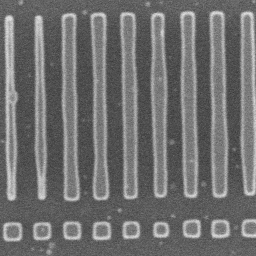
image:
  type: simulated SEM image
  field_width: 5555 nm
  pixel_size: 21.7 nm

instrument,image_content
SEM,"groups of lines, slits or small figures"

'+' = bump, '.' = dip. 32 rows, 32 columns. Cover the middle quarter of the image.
+++.....++.....+++....+++.....++
+++.....++.....+++....+++.....++
+++.....++.....+++....+++.....++
+++.....++.....+++....+++.....++
+++.....++.....+++....+++.....++
+++.....++.....+++....+++.....++
+++.....++.....+++....+++.....++
+++.....++.....+++....+++.....++
+++.....++.....+++....+++.....++
+++.....++.....+++....+++.....++
+++.....++.....+++....+++.....++
+++.....++.....+++....+++.....++
+++.....++.....+++....+++.....++
+++.....++.....+++....+++.....++
+++.....++.....+++.....++.....++
+++.....++.....+++.....++.....++
+++.....++.....+++.....++.....++
+++.....++.....+++.....++.....++
+++.....++.....+++.....++.....++
+++.....++.....+++.....++.....++
+++.....++.....+++.....++.....++
+++.....++.....+++.....++.....++
+++.....++.....+++.....++.....++
+++.....++.....+++.....++.....++
+++.....++.....+++.....++.....++
+++.....++.....+++.....++.....++
+++.....+++....+++.....++.....++
+++.....+++....+++.....++.....++
+++.....+++....+++.....++.....++
+++.....+++....+++.....++.....++
+++.....+++....+++.....++.....++
+++.....+++....+++.....++.....++